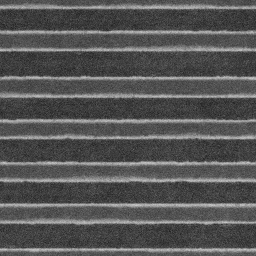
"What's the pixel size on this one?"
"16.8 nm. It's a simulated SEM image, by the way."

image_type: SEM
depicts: lines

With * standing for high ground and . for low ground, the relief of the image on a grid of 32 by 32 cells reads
********************************
................................
................................
................................
********************************
********************************
................................
................................
................................
................................
********************************
********************************
................................
................................
................................
********************************
********************************
................................
................................
................................
********************************
********************************
**********........**************
................................
................................
................................
********************************
********************************
................................
................................
................................
********************************